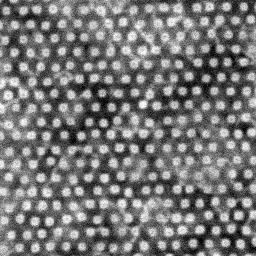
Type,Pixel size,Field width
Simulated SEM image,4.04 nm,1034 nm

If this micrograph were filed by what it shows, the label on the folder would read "a regular array of raised bodies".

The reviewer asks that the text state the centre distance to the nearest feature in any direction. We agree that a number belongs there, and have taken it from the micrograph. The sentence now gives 57.5 nanometres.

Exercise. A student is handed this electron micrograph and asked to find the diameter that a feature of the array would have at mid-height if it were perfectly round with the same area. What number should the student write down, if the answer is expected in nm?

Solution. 28.8